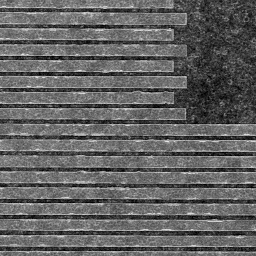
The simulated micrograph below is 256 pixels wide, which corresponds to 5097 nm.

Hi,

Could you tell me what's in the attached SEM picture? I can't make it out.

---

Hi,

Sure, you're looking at parallel lines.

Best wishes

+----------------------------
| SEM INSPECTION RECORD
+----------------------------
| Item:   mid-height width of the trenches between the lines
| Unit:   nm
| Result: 94.6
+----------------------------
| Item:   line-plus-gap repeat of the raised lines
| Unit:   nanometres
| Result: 316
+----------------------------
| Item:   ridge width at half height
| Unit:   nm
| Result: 219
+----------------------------